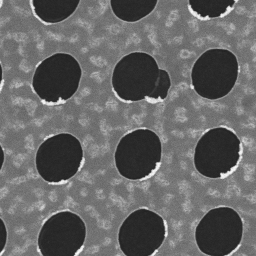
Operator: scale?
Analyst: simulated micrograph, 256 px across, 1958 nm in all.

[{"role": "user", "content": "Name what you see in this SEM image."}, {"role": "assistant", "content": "holes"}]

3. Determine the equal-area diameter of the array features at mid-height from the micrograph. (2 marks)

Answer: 0.368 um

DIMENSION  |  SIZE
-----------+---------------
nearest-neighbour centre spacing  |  591 nm